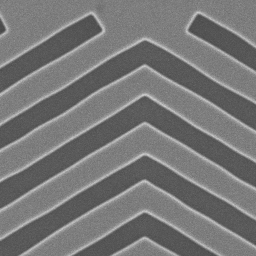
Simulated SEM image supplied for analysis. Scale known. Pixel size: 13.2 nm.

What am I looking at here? groups of lines, slits or small figures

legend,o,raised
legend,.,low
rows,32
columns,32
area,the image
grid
oooooooooooooooooooooooooooooooo
oooooooooooooooooooooooooooooooo
oooooooooo..oooooooooooo..oooooo
.ooooooo.....ooooooooooo....oooo
oooooo......oooooooooooo......oo
ooooo.....ooooooo..ooooooo.....o
ooo......oooooo......ooooooo....
oo.....oooooo..........ooooooo..
.....ooooooo.....oo.....ooooooo.
...ooooooo......oooo......oooooo
..ooooooo.....oooooooo.....ooooo
ooooooo.....oooooooooooo.....ooo
ooooo.....ooooooo..ooooooo.....o
oooo.....oooooo......oooooo.....
oo.....ooooooo........ooooooo...
......oooooo............oooooo..
....ooooooo.....oooo......oooooo
..ooooooo.....oooooooo.....ooooo
ooooooo......ooooooooooo.....ooo
oooooo.....oooooooooooooo......o
oooo.....ooooooo....ooooooo.....
oo......oooooo........ooooooo...
......ooooooo...........oooooo..
....ooooooo.....oooo.....ooooooo
...oooooo......ooooooo.....ooooo
.ooooooo.....oooooooooo......ooo
oooooo.....oooooooooooooo.....oo
oooo.....ooooooo....oooooo......
oo......ooooooo.......oooooo....
o.....ooooooo..........ooooooo..
.....oooooo.....oooo.....oooooo.
...ooooooo.....oooooo......ooooo